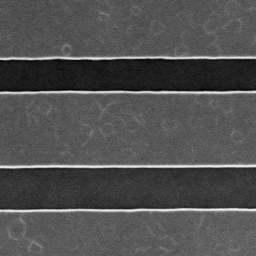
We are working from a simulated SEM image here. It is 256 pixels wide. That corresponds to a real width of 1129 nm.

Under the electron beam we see one or a few lines or trenches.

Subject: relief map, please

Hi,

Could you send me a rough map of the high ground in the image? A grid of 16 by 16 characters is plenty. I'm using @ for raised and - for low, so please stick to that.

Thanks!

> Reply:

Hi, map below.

@@@@@@@@@@@@@@@@
@@@@@@@@@@@@@@@@
@@@@@@@@@@@@@@@@
@@@@@@@@@@@@@@@@
----------------
----------------
@@@@@@@@@@@@@@@@
@@@@@@@@@@@@@@@@
@@@@@@@@@@@@@@@@
@@@@@@@@@@@@@@@@
----------------
----------------
----------------
@@@@@@@@@@@@@@@@
@@@@@@@@@@@@@@@@
@@@@@@@@@@@@@@@@